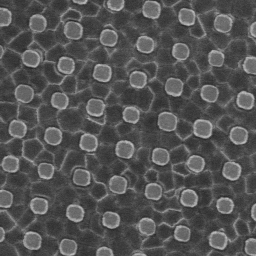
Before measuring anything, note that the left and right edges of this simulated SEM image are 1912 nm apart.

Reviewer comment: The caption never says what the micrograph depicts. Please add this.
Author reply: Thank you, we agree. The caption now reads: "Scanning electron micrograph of a regular array of raised bodies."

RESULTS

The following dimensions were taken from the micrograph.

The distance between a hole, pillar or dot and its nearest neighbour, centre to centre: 264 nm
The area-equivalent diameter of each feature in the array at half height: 130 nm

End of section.